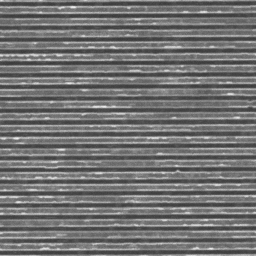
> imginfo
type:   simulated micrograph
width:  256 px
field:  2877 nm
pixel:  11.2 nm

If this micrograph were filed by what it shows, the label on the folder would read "parallel lines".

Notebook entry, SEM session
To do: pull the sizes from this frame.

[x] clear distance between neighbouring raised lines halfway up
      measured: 59 nm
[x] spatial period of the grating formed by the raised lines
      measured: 11.8 px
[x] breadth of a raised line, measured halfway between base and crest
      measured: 78.7 nanometres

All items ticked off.